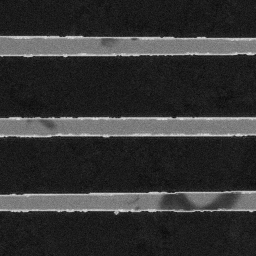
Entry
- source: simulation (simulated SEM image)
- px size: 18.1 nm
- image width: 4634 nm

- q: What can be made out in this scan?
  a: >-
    lines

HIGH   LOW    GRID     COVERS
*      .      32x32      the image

................................
................................
................................
................................
................................
********************************
********************************
................................
................................
................................
................................
................................
................................
................................
................................
********************************
********************************
................................
................................
................................
................................
................................
................................
................................
********************************
********************************
................................
................................
................................
................................
................................
................................